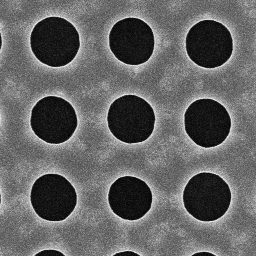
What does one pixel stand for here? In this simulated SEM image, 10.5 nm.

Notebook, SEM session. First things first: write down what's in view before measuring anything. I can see a regular array of holes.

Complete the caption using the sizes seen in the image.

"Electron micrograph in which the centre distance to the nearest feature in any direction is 809 nm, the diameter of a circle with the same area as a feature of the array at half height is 506 nm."